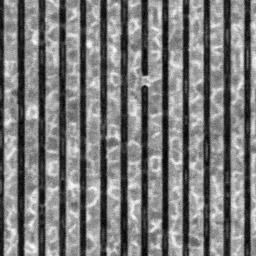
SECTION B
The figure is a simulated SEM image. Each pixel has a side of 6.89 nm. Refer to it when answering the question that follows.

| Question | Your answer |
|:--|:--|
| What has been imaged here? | parallel lines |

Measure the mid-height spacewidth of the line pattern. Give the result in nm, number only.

51.7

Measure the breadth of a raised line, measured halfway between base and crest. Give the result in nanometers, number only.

91.4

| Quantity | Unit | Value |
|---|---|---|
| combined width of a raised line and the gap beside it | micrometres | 0.142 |